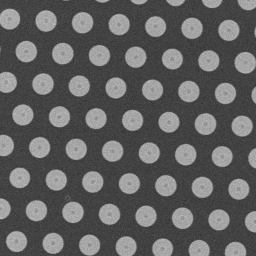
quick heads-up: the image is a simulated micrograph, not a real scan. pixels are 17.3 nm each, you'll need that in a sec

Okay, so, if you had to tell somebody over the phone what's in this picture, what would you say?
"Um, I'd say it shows an array of small figures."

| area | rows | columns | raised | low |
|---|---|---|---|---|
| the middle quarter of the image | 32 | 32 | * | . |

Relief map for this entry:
.................**......****...
................................
................................
..***.......*...................
.*****.....****......***......**
.*****.....****.....****.....***
.*****....*****.....*****....***
..***......****.....****.....***
............*........***.....***
................................
................................
*......***......................
*.....****.....****......***....
*.....****.....*****....****....
*.....****.....*****....*****...
......****.....****.....*****...
................**.......***....
................................
................................
.****......**...................
.****.....****.....****......***
.*****....*****....*****....****
.****.....*****....*****....****
..**......****.....*****....****
....................***......***
................................
................................
......***.......*...............
*....****.....****......***.....
*....*****....*****....*****....
.....*****....*****....*****....
......***.....****.....*****....